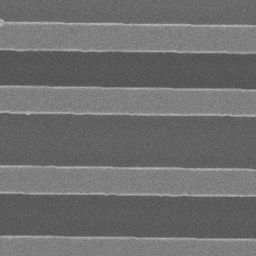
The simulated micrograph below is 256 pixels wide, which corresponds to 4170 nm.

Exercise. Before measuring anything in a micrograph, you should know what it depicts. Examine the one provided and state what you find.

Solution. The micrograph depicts lines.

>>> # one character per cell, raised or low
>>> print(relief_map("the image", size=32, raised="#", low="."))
................................
................................
................................
################################
################################
################################
.....................###########
................................
................................
................................
................................
################################
################################
################################
...........................#.###
................................
................................
................................
................................
................................
................................
################################
################################
################################
................................
................................
................................
................................
................................
................................
################################
################################